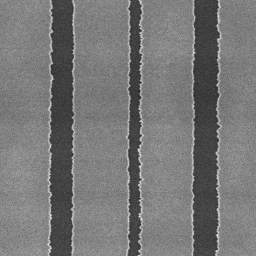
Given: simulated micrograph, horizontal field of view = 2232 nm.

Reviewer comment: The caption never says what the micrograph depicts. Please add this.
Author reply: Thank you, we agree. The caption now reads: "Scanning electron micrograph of one or a few lines or trenches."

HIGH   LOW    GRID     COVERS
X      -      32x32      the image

XXXXXX---XXXXXXX--XXXXXX---XXXXX
XXXXXX---XXXXXXX--XXXXXX---XXXXX
XXXXXX---XXXXXXX--XXXXXX---XXXXX
XXXXXX---XXXXXXX--XXXXXX---XXXXX
XXXXXX---XXXXXXX--XXXXXX---XXXXX
XXXXXX---XXXXXXX--XXXXXX---XXXXX
XXXXXX---XXXXXXX--XXXXXX---XXXXX
XXXXXX---XXXXXXX--XXXXXX---XXXXX
XXXXXX---XXXXXXX--XXXXXX---XXXXX
XXXXXX---XXXXXXX--XXXXXX---XXXXX
XXXXXX---XXXXXXX--XXXXXX---XXXXX
XXXXXX---XXXXXXX--XXXXXX---XXXXX
XXXXXX---XXXXXXX--XXXXXX---XXXXX
XXXXXX---XXXXXXX-XXXXXXX---XXXXX
XXXXXX---XXXXXXX--XXXXXX---XXXXX
XXXXXX---XXXXXXX--XXXXXX---XXXXX
XXXXXX---XXXXXXX--XXXXXX---XXXXX
XXXXXX---XXXXXXX--XXXXXX---XXXXX
XXXXXX---XXXXXXX-XXXXXXX---XXXXX
XXXXXX---XXXXXXX-XXXXXXX---XXXXX
XXXXXX---XXXXXXX--XXXXXX---XXXXX
XXXXXX---XXXXXXX--XXXXXX---XXXXX
XXXXXX---XXXXXXX--XXXXXX---XXXXX
XXXXXX---XXXXXXX-XXXXXXX---XXXXX
XXXXXX---XXXXXXX--XXXXXX---XXXXX
XXXXXX---XXXXXXX--XXXXXX---XXXXX
XXXXXX---XXXXXXX--XXXXXX---XXXXX
XXXXXX---XXXXXXX--XXXXXX---XXXXX
XXXXXX---XXXXXXX--XXXXXX---XXXXX
XXXXXX---XXXXXXX--XXXXXX---XXXXX
XXXXXX---XXXXXXX--XXXXXX---XXXXX
XXXXXX---XXXXXXX--XXXXXX---XXXXX